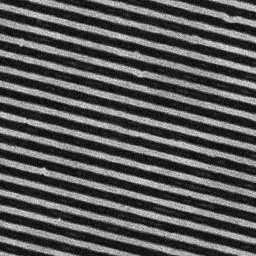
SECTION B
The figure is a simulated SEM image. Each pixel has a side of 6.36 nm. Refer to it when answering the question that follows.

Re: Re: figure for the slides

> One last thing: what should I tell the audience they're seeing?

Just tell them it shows parallel lines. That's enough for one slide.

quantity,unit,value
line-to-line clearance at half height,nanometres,55.5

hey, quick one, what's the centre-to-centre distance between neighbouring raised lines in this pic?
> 95.7 nm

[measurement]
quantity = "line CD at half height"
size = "37 nm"